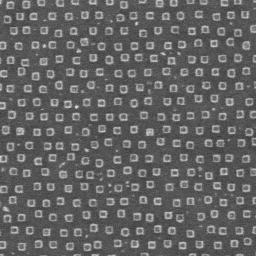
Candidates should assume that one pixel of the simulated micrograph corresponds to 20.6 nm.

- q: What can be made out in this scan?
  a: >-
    a regular array of raised bodies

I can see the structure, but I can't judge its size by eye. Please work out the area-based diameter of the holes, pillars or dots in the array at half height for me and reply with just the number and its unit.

149 nm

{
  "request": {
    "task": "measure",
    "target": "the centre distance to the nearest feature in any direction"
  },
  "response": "288 nanometers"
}